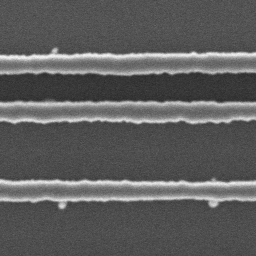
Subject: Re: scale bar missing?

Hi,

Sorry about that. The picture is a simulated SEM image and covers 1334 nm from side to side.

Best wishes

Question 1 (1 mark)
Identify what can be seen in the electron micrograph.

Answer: lines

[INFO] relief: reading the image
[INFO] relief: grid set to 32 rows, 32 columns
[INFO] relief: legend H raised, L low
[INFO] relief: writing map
LLLLLLLLLLLLLLLLLLLLLLLLLLLLLLLL
LLLLLLLLLLLLLLLLLLLLLLLLLLLLLLLL
LLLLLLLLLLLLLLLLLLLLLLLLLLLLLLLL
LLLLLLLLLLLLLLLLLLLLLLLLLLLLLLLL
LLLLLLLLLLLLLLLLLLLLLLLLLLLLLLLL
LLLLLLLLLLLLLLLLLLLLLLLLLLLLLLLL
LLLLLLLLLLLLLLLLLLLLLLLLLLLLLLLL
HHHHHHHHHHHHHHHHHHHHHHHHHHHHHHHH
HHHHHHHHHHHHHHHHHHHHHHHHHHHHHHHH
LLLLLLLLLLLLLLLLLLLLLLLLLLLLLLLL
LLLLLLLLLLLLLLLLLLLLLLLLLLLLLLLL
LLLLLLLLLLLLLLLLLLLLLLLLLLLLLLLL
LLLLLLLLLLLLLLLLLLLLLLLLLLLLLLLL
HHHHHHHHHHHHHHHHHHHHHHHHHHHHHHHH
HHHHHHHHHHHHHHHHHHHHHHHHHHHHHHHH
LLLLLLLLLLLLLLLLLLLLLLLLLLLLLLLL
LLLLLLLLLLLLLLLLLLLLLLLLLLLLLLLL
LLLLLLLLLLLLLLLLLLLLLLLLLLLLLLLL
LLLLLLLLLLLLLLLLLLLLLLLLLLLLLLLL
LLLLLLLLLLLLLLLLLLLLLLLLLLLLLLLL
LLLLLLLLLLLLLLLLLLLLLLLLLLLLLLLL
LLLLLLLLLLLLLLLLLLLLLLLLLLLLLLLL
LLLLLLLLLLLLLLLLLLLLLLLLLLLLLLLL
HHHHHHHHHHHHHHHHHHHHHHHHHHHHHHHH
HHHHHHHHHHHHHHHHHHHHHHHHHHHHHHHH
LLLLLLLLLLLLLLLLLLLLLLLLLLLLLLLL
LLLLLLLLLLLLLLLLLLLLLLLLLLLLLLLL
LLLLLLLLLLLLLLLLLLLLLLLLLLLLLLLL
LLLLLLLLLLLLLLLLLLLLLLLLLLLLLLLL
LLLLLLLLLLLLLLLLLLLLLLLLLLLLLLLL
LLLLLLLLLLLLLLLLLLLLLLLLLLLLLLLL
LLLLLLLLLLLLLLLLLLLLLLLLLLLLLLLL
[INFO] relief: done